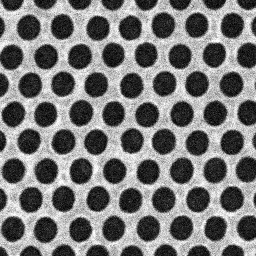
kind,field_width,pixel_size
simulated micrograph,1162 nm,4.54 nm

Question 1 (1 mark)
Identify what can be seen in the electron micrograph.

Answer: a regular array of holes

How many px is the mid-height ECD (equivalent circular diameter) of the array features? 25.5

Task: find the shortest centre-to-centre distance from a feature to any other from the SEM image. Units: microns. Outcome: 0.148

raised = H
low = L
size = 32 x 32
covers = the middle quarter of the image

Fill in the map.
HHLLLLHHHHHLLLHHHHHLLLHHHHHLLLLH
HHHLHHHHHHHHHHHHHHHHHHHHHHHHHHHH
LLHHHHLLLLHHHHHHLLHHHHHLLLLHHHHL
LLHHHLLLLLLHHHHLLLLHHHLLLLLLHHHL
LLLHHLLLLLLHHHLLLLLLHHLLLLLLHHLL
LLLHHLLLLLLHHHLLLLLLHHLLLLLLHHLL
LLHHHLLLLLLHHHLLLLLLHHLLLLLLHHLL
LLHHHHLLLLHHHHLLLLLHHHHLLLLHHHHL
HHHHHHHLHHHHHHHLLLHHHHHHHHHHHHHH
HHHLLLHHHHHLLLHHHHHHLHHHHHHHHLLH
HHLLLLLHHHLLLLLHHHHLLLLHHHHLLLLL
HLLLLLLHHHLLLLLHHHLLLLLLHHHLLLLL
HLLLLLLHHLLLLLLHHHLLLLLLHHLLLLLL
HLLLLLLHHLLLLLLHHHLLLLLLHHLLLLLL
HHLLLLLHHHLLLLLHHHLLLLLHHHHLLLLL
HHHLLHHHHHHLLLHHHHHLLLHHHHHHLLLH
LHHHHHHLLHHHHHHLLLLHHHHHLLHHHHHH
LLHHHHLLLLLHHHLLLLLHHHLLLLLHHHHL
LLLHHLLLLLLHHHLLLLLLHHLLLLLLHHHL
LLLHHLLLLLLHHHLLLLLLHHLLLLLLHHLL
LLLHHLLLLLLHHHLLLLLLHHLLLLLLHHLL
LLHHHHLLLLLHHHHLLLLHHHLLLLLHHHHL
LHHHHHLLLLHHHHHHLLHHHHHLLLHHHHHL
HHHHLHHHHHHHHHHHHHHHHHHHHHHHLLLH
HHLLLLLHHHHLLLLHHHHLLLLHHHHLLLLL
HHLLLLLHHHLLLLLLHHHLLLLLHHHLLLLL
HLLLLLLHHHLLLLLLHHLLLLLLHHLLLLLL
HLLLLLLHHHLLLLLLHHLLLLLLHHLLLLLL
HHLLLLLHHHLLLLLHHHLLLLLLHHHLLLLL
HHLLLLHHHHHLLLLHHHHLLLLHHHHHLLLH
LHHHHHHHLHHHHHHHHHHHHHHHHHHHHHHH
LLHHHHHLLLLHHHHLLLLHHHHLLLLHHHHL